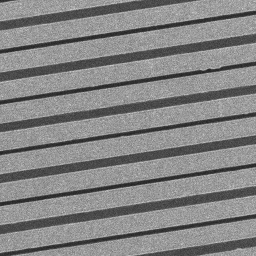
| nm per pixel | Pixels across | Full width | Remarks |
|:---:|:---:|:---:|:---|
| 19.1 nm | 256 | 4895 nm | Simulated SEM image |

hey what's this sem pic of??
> parallel lines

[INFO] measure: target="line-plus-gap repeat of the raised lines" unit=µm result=0.48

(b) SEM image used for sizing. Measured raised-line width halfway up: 347 nm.